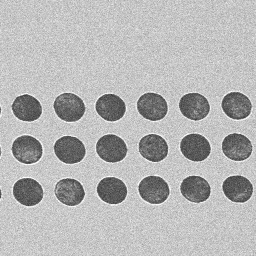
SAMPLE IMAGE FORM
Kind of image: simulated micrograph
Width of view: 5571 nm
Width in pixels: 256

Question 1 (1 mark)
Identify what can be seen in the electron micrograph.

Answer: a regular array of holes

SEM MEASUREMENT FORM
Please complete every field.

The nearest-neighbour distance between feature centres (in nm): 903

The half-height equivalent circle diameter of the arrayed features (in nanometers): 644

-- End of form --